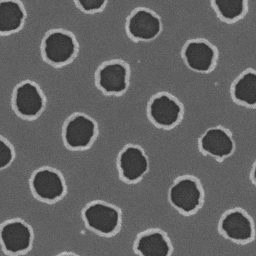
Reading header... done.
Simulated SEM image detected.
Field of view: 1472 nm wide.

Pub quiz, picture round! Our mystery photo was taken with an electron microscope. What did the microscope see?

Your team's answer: a regular array of holes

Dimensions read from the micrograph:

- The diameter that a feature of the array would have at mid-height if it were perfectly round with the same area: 170 nm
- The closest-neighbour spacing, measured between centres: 0.35 microns